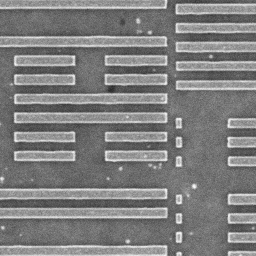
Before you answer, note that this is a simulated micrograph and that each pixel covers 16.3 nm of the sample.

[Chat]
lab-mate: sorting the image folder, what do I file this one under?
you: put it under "wiring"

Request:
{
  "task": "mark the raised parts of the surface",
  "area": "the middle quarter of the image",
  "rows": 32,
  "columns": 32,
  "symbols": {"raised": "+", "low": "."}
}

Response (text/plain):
............................++++
................................
................................
+++.......++++++++++++++++......
+++.......++++++++++++++++..++++
............................++++
................................
................................
++++++++++++++++++++++++++......
++++++++++++++++++++++++++......
................................
................................
++++++++++++++++++++++++++......
++++++++++++++++++++++++++......
............................+...
............................+...
................................
+++.......++++++++++++++++......
+++.......++++++++++++++++......
............................+...
............................+...
................................
+++.......++++++++++++++++......
+++.......++++++++++++++++..+...
............................+...
................................
................................
................................
................................
................................
................................
++++++++++++++++++++++++++......